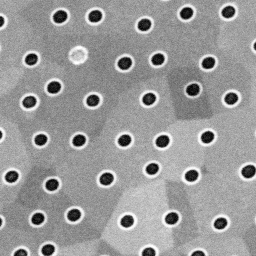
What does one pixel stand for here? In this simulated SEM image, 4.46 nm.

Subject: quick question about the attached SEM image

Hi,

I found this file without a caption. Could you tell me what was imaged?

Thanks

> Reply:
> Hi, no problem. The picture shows a regular array of holes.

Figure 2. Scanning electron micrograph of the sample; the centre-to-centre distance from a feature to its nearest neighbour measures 0.166 µm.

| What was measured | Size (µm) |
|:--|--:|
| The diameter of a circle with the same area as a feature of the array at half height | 0.0681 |